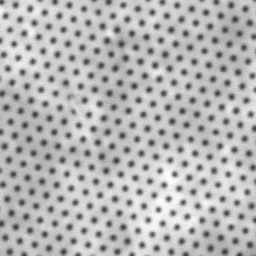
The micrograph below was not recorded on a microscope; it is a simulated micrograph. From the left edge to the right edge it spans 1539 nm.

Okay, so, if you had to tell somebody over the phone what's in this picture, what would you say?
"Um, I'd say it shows a regular array of holes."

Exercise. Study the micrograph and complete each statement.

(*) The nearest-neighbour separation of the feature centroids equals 87.3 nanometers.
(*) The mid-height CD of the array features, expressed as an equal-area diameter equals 40.7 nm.